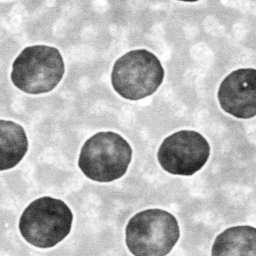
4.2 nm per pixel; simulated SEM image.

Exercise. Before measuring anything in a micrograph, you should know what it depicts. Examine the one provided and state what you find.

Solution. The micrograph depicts holes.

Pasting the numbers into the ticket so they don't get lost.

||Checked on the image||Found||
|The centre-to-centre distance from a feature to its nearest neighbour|370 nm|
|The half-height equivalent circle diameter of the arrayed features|219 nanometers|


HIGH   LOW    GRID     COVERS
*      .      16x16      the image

****************
****************
****************
*...****..******
*...***...****..
*..****...****..
**************..
****************
..****..***..***
..***...**...***
.****...**...***
****************
**..************
*....***...*****
*...****...***..
********...**...